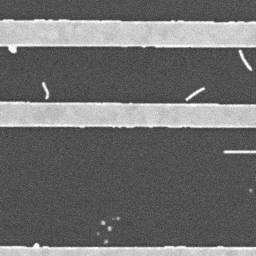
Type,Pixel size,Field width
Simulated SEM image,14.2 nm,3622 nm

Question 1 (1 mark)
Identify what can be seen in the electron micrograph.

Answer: lines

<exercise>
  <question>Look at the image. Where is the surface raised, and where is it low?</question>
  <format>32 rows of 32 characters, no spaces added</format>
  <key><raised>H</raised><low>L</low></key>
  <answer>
LLLLLLLLLLLLLLLLLLLLLLLLLLLLLLLL
LLLLLLLLLLLLLLLLLLLLLLLLLLLLLLLL
LLLLLLLLLLLLLLLLLLLLLLLLLLLLLLLL
HHHHHHHHHHHHHHHHHHHHHHHHHHHHHHHH
HHHHHHHHHHHHHHHHHHHHHHHHHHHHHHHH
HHHHHHHHHHHHHHHHHHHHHHHHHHHHHHHH
LLLLLLLLLLLLLLLLLLLLLLLLLLLLLLLL
LLLLLLLLLLLLLLLLLLLLLLLLLLLLLLLL
LLLLLLLLLLLLLLLLLLLLLLLLLLLLLLLL
LLLLLLLLLLLLLLLLLLLLLLLLLLLLLLLL
LLLLLLLLLLLLLLLLLLLLLLLLLLLLLLLL
LLLLLLLLLLLLLLLLLLLLLLLLLLLLLLLL
LLLLLLLLLLLLLLLLLLLLLLLLLLLLLLLL
HHHHHHHHHHHHHHHHHHHHHHHHHHHHHHHH
HHHHHHHHHHHHHHHHHHHHHHHHHHHHHHHH
HHHHHHHHHHHHHHHHHHHHHHHHHHHHHHHH
LLLLLLLLLLLLLLLLLLLLLLLLLLLLLLLL
LLLLLLLLLLLLLLLLLLLLLLLLLLLLLLLL
LLLLLLLLLLLLLLLLLLLLLLLLLLLLLLLL
LLLLLLLLLLLLLLLLLLLLLLLLLLLLLLLL
LLLLLLLLLLLLLLLLLLLLLLLLLLLLLLLL
LLLLLLLLLLLLLLLLLLLLLLLLLLLLLLLL
LLLLLLLLLLLLLLLLLLLLLLLLLLLLLLLL
LLLLLLLLLLLLLLLLLLLLLLLLLLLLLLLL
LLLLLLLLLLLLLLLLLLLLLLLLLLLLLLLL
LLLLLLLLLLLLLLLLLLLLLLLLLLLLLLLL
LLLLLLLLLLLLLLLLLLLLLLLLLLLLLLLL
LLLLLLLLLLLLLLLLLLLLLLLLLLLLLLLL
LLLLLLLLLLLLLLLLLLLLLLLLLLLLLLLL
LLLLLLLLLLLLLLLLLLLLLLLLLLLLLLLL
LLLLLLLLLLLLLLLLLLLLLLLLLLLLLLLL
HHHHHHHHHHHHHHHHHHHHHHHHHHHHHHHH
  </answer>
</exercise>